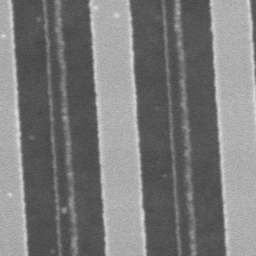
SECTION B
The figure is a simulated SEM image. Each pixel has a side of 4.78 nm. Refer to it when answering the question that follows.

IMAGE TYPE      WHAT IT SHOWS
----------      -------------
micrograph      lines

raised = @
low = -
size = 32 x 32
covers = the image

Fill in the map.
@-----@----@@@@@----@@----@@@@@-
@-----@----@@@@@----@@----@@@@@-
@-----@----@@@@@----@@-----@@@@-
@-----@----@@@@@-----@-----@@@@-
@@----@-----@@@@-----@-----@@@@-
@@----@@----@@@@-----@-----@@@@@
@@----@@----@@@@@----@@----@@@@@
@@----@@----@@@@@----@@----@@@@@
@@----@@----@@@@@----@@----@@@@@
@@----@@----@@@@@----@@----@@@@@
@@----@@----@@@@@----@@----@@@@@
@@----@@----@@@@@----@@----@@@@@
@@----@@----@@@@@----@@----@@@@@
@@----@@----@@@@@----@@----@@@@@
@@----@@----@@@@@----@@----@@@@@
@@----@@----@@@@@----@@----@@@@@
@@----@@----@@@@@----@@----@@@@@
@@----@@@---@@@@@----@@----@@@@@
@@-----@@---@@@@@----@@-----@@@@
@@-----@@----@@@@-----@-----@@@@
@@@----@@----@@@@-----@-----@@@@
@@@----@@----@@@@-----@@----@@@@
@@@----@@----@@@@@----@@----@@@@
@@@----@@----@@@@@----@@----@@@@
@@@----@@----@@@@@----@@----@@@@
@@@----@@----@@@@@----@@----@@@@
@@@----@@----@@@@@----@@----@@@@
@@@----@@----@@@@@----@@----@@@@
@@@----@@----@@@@@----@@----@@@@
@@@----@@----@@@@@----@@----@@@@
@@@----@@----@@@@@----@@----@@@@
@@@----@@----@@@@@----@@----@@@@